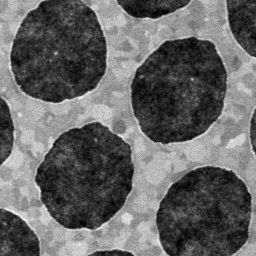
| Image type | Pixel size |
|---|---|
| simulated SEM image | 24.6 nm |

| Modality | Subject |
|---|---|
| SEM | holes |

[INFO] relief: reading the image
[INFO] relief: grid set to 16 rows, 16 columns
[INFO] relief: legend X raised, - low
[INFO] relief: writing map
XX----XX---XXX--
X-----XXXXXXXX--
X------XXXX--XX-
X------XX-----XX
X------X------XX
X-----XX------XX
XXXXXXXX------XX
-XXXXXXXX-----XX
-XXX---XX---XXXX
-XX-----XXXXXXXX
XX------XXXX--XX
XX------XXX----X
XXX-----XX------
-XX----XXX------
--XXXXXXXX------
---XXXXXXX-----X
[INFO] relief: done